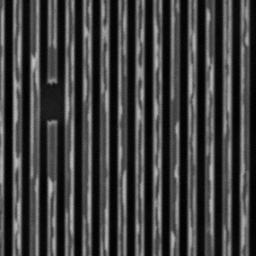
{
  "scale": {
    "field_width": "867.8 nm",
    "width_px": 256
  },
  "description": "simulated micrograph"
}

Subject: parallel lines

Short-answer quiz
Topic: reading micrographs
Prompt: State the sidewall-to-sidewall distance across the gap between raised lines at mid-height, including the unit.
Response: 28.4 nm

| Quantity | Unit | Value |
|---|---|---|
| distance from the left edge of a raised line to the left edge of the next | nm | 59.3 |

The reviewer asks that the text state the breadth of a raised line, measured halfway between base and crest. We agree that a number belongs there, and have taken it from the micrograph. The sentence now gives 31.4 nm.